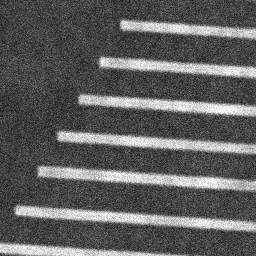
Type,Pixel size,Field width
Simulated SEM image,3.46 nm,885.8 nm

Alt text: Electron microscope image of parallel lines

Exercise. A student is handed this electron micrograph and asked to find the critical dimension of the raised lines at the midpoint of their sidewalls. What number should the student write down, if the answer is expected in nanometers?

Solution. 28.9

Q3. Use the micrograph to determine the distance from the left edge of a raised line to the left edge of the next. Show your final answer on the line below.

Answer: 134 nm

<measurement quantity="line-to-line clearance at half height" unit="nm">102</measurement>